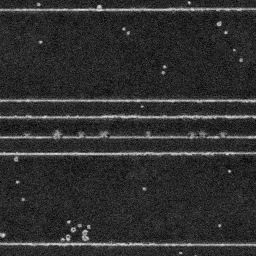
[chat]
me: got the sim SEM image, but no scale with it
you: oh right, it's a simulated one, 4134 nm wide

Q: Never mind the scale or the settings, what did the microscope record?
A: lines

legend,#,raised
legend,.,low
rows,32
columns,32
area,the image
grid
################################
................................
................................
................................
................................
................................
................................
................................
................................
................................
................................
................................
................................
################################
################################
................................
................................
################################
################################
................................
................................
................................
................................
................................
................................
................................
................................
................................
................................
................................
................................
################################